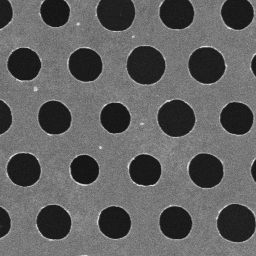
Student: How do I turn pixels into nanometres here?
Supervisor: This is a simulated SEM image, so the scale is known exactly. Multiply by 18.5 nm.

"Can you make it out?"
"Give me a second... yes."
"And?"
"a regular array of holes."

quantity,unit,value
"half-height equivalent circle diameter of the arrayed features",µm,0.629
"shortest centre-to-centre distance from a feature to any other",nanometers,1120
